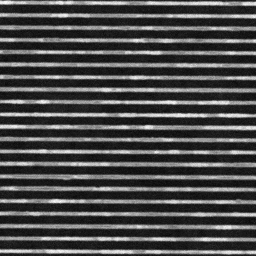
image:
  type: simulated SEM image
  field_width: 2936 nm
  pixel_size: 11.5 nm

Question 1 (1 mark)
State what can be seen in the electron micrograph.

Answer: parallel lines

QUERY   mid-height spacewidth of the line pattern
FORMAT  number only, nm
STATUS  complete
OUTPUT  110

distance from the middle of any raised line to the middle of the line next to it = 143 nm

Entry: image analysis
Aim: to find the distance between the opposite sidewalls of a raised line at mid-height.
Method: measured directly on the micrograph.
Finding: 27.2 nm